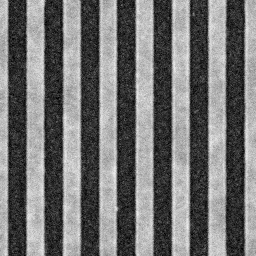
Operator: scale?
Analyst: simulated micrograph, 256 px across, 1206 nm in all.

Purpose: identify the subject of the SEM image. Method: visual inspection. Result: parallel lines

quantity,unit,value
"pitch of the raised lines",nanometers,171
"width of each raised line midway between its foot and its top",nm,77.1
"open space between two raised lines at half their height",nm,95.4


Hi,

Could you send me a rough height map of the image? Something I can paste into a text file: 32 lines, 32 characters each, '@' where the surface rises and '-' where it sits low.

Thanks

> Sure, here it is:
@--@@---@@---@@--@@---@@--@@---@
@---@---@@---@@--@@---@@--@@---@
@---@---@@---@@--@@---@@--@@---@
@--@@---@@---@@--@@---@@--@@---@
@--@@---@@---@@--@@---@@--@@---@
@--@@---@@---@@--@@---@@--@@---@
@---@---@@---@@--@@---@@--@@---@
@--@@---@@---@@--@@---@@--@@---@
@--@@---@@---@@--@@---@@--@@---@
@---@---@@---@@--@@---@@--@@---@
@---@---@@---@@--@@---@@--@@---@
@---@---@@---@@--@@---@@--@@---@
@--@@---@@---@@--@@---@@--@@---@
@--@@---@@---@@--@@---@@--@@---@
@---@---@@---@@--@@---@@--@@---@
@---@---@@---@@--@@---@@--@@---@
@---@---@@---@@--@@---@@--@@---@
@--@@---@@---@@--@@---@@--@@---@
@--@@---@@---@@--@@---@@--@@---@
@--@@---@@---@@--@@---@@--@@---@
@--@@---@@---@@--@@---@@--@@---@
@--@@---@@---@@--@@---@@--@@---@
@---@---@@---@@--@@---@@--@@---@
@--@@---@@---@@--@@---@@--@@---@
@--@@---@@---@@--@@---@@--@@---@
@--@@---@@---@@--@@---@@--@@---@
@--@@---@@---@@--@@---@@--@@---@
@--@@---@@---@@--@@---@@--@@---@
@---@---@@---@@--@@---@@--@@---@
@--@@---@@---@@--@@---@@--@@---@
@--@@---@@---@@--@@---@@--@@---@
@--@@---@@---@@--@@---@@--@@---@